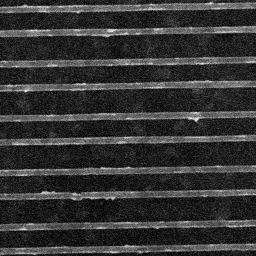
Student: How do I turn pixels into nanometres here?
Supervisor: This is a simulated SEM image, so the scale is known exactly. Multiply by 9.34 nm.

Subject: parallel lines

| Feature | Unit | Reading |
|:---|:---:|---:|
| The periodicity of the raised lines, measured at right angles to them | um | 0.251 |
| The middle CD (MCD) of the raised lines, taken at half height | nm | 52.5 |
